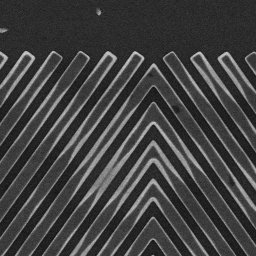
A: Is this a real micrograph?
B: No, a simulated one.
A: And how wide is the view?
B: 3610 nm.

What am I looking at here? groups of lines, slits or small figures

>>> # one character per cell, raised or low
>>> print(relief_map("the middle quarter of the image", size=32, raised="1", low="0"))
01111000111100011110001000111100
11110000111000011100011100011100
11110001110000111000111100001110
11100011110001111000111110001111
11000111100011110001111111000111
11001111000011100011111111000011
10001111000111000111100111100011
00011110001111000111100011110001
00111100011110001111000001111000
00111000011100001110000000111000
01111000111000011100011000111100
11110001111000111000011100011110
11100011110000111000111110001110
11000011100001110001111110001111
11000111100011100001111111000111
10001111000111000011100111100011
00001110000111000111100011110011
00011100001110000111000001110001
00011100011100001110000000111000
00111000011000011110000000111000
01110000111000011100001000011100
11100001110000111000011100001110
11100001100001110000111100000110
11000011000001100001111110000111
10000111000011100001110111000011
10001110000111000011100011000001
00011100000110000111000011100001
00111100001100000110000001110000
00111000011000001110000000111000
01110000011000011100000000111100
11110000110000011000011100011110
11100001100000111000111100001110